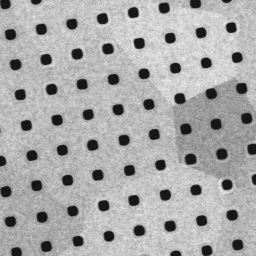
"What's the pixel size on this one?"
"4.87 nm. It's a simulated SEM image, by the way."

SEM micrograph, a regular array of holes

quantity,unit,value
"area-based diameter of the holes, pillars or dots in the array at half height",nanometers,55.7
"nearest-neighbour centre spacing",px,30.5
